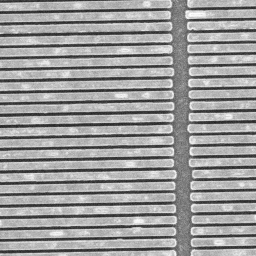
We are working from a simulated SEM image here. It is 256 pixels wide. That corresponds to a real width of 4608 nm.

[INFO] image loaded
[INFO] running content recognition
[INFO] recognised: parallel lines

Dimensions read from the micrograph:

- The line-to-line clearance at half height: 63 nanometers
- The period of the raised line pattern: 205 nanometers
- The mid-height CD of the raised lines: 140 nm